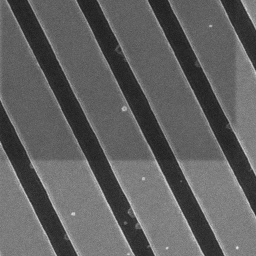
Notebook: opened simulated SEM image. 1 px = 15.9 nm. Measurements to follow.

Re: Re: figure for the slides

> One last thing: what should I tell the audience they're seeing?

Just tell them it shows lines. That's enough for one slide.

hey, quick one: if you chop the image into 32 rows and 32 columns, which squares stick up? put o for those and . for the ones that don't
o...oooooo..ooooooo..ooooooo..oo
oo..oooooo...oooooo...oooooo...o
oo...oooooo..ooooooo..ooooooo..o
ooo..oooooo...oooooo...oooooo...
ooo...oooooo..ooooooo..ooooooo..
oooo..oooooo...oooooo...oooooo..
oooo...oooooo..ooooooo..ooooooo.
ooooo..oooooo...oooooo...oooooo.
ooooo...oooooo..ooooooo..ooooooo
oooooo..oooooo...oooooo...oooooo
oooooo...oooooo..ooooooo..oooooo
ooooooo..oooooo...oooooo...ooooo
ooooooo...oooooo..ooooooo..ooooo
.ooooooo..oooooo...oooooo...oooo
.ooooooo...oooooo..ooooooo..oooo
..ooooooo..oooooo...oooooo...ooo
..ooooooo...oooooo..ooooooo..ooo
...ooooooo..oooooo...oooooo...oo
...ooooooo...oooooo..ooooooo..oo
o..oooooooo..oooooo...oooooo...o
o...ooooooo...oooooo..ooooooo..o
oo...ooooooo..oooooo...oooooo...
oo...ooooooo...oooooo..ooooooo..
ooo...ooooooo..oooooo...oooooo..
ooo...ooooooo...oooooo..ooooooo.
oooo..oooooooo..oooooo...oooooo.
oooo...ooooooo...oooooo..ooooooo
ooooo..oooooooo..oooooo...oooooo
ooooo...ooooooo...oooooo..oooooo
oooooo...ooooooo..oooooo...ooooo
oooooo...ooooooo...oooooo..ooooo
ooooooo...ooooooo..oooooo...oooo